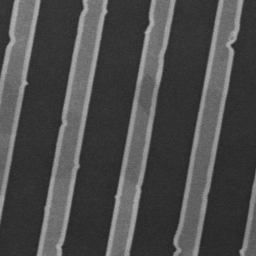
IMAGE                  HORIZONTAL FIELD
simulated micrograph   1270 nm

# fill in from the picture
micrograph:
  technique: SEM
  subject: one or a few lines or trenches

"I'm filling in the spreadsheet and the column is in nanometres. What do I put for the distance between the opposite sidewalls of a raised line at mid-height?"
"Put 100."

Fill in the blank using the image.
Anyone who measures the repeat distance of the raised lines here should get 332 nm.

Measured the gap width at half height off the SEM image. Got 0.232 µm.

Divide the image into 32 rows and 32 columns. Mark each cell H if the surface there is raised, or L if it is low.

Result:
LLHHHLLLLLLHHLLLLLLHHHLLLLLLHHLL
LLHHHLLLLLHHHLLLLLLHHLLLLLLHHHLL
LLHHLLLLLLHHHLLLLLLHHLLLLLLHHHLL
LHHHLLLLLLHHHLLLLLLHHLLLLLLHHHLL
LHHHLLLLLLHHLLLLLLHHHLLLLLLHHLLL
LHHHLLLLLLHHLLLLLLHHHLLLLLLHHLLL
LHHHLLLLLHHHLLLLLLHHLLLLLLHHHLLL
LHHHLLLLLHHHLLLLLLHHLLLLLLHHHLLL
HHHLLLLLLHHHLLLLLLHHLLLLLLHHHLLL
HHHLLLLLLHHHLLLLLLHHLLLLLLHHHLLL
HHHLLLLLLHHLLLLLLHHHLLLLLLHHLLLL
HHHLLLLLLHHLLLLLLHHLLLLLLLHHLLLL
HHHLLLLLHHHLLLLLLHHLLLLLLHHHLLLL
HHLLLLLLHHHLLLLLLHHLLLLLLHHHLLLL
HHLLLLLLHHHLLLLLLHHLLLLLLHHHLLLL
HHLLLLLLHHLLLLLLHHHLLLLLLHHLLLLL
HHLLLLLLHHLLLLLLHHHLLLLLLHHLLLLL
HHLLLLLHHHLLLLLLHHHLLLLLHHHLLLLL
HLLLLLLHHHLLLLLLHHLLLLLLHHHLLLLL
HLLLLLLHHHLLLLLLHHLLLLLLHHHLLLLL
HLLLLLLHHHLLLLLLHHLLLLLLHHHLLLLL
HLLLLLLHHLLLLLLHHHLLLLLLHHLLLLLL
HLLLLLHHHLLLLLLHHHLLLLLLHHLLLLLL
HLLLLLHHHLLLLLLHHLLLLLLHHHLLLLLL
LLLLLLHHHLLLLLLHHLLLLLLHHHLLLLLL
LLLLLLHHHLLLLLLHHLLLLLLHHHLLLLLH
LLLLLLHHHLLLLLHHHLLLLLLHHLLLLLLH
LLLLLLHHLLLLLLHHHLLLLLLHHLLLLLLH
LLLLLHHHLLLLLLHHHLLLLLHHHLLLLLLH
LLLLLHHHLLLLLLHHLLLLLLHHHLLLLLLH
LLLLLHHHLLLLLLHHLLLLLLHHHLLLLLLH
LLLLLHHLLLLLLHHHLLLLLLHHHLLLLLHH